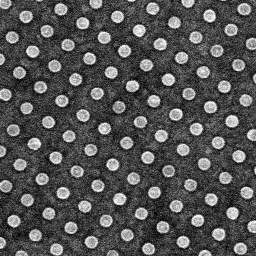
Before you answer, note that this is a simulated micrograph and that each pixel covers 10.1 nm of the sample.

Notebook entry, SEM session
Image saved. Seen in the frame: a regular array of raised bodies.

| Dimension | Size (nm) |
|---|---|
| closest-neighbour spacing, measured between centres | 252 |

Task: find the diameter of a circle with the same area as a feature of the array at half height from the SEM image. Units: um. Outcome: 0.115